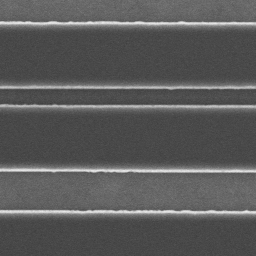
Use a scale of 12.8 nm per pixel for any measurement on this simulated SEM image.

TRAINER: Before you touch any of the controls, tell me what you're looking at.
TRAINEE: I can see lines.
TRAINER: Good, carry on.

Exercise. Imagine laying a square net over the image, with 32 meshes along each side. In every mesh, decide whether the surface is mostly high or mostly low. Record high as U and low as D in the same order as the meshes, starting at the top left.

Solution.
DDDDDDDDDDDDDDDDDDDDDDDDDDDDDDDD
DDDDDDDDDDDDDDDDDDDDDDDDDDDDDDDD
DDDDDDDDDDDDDDDDDDDDDDDDDDDDDDDD
UUUUUUUUUUUUUUUUUUUUUUUUUUUUUUUU
UUUUUUUUUUUUUUUUUUUUUUUUUUUUUUUU
UUUUUUUUUUUUUUUUUUUUUUUUUUUUUUUU
UUUUUUUUUUUUUUUUUUUUUUUUUUUUUUUU
UUUUUUUUUUUUUUUUUUUUUUUUUUUUUUUU
UUUUUUUUUUUUUUUUUUUUUUUUUUUUUUUU
UUUUUUUUUUUUUUUUUUUUUUUUUUUUUUUU
UUUUUUUUUUUUUUUUUUUUUUUUUUUUUUUU
DDDDDDDDDDDDDDDDDDDDDDDDDDDDDDDD
DDDDDDDDDDDDDDDDDDDDDDDDDDDDDDDD
UUUUUUUUUUUUUUUUUUUUUUUUUUUUUUUU
UUUUUUUUUUUUUUUUUUUUUUUUUUUUUUUU
UUUUUUUUUUUUUUUUUUUUUUUUUUUUUUUU
UUUUUUUUUUUUUUUUUUUUUUUUUUUUUUUU
UUUUUUUUUUUUUUUUUUUUUUUUUUUUUUUU
UUUUUUUUUUUUUUUUUUUUUUUUUUUUUUUU
UUUUUUUUUUUUUUUUUUUUUUUUUUUUUUUU
UUUUUUUUUUUUUUUUUUUUUUUUUUUUUUUU
DDDDDDDDDDDDDDDDDDDDDDDDDDDDDDDD
DDDDDDDDDDDDDDDDDDDDDDDDDDDDDDDD
DDDDDDDDDDDDDDDDDDDDDDDDDDDDDDDD
DDDDDDDDDDDDDDDDDDDDDDDDDDDDDDDD
DDDDDDDDDDDDDDDDDDDDDDDDDDDDDDDD
UUUUUUUUUUUUUUUUUUUUUUUUUUUUUUUU
UUUUUUUUUUUUUUUUUUUUUUUUUUUUUUUU
UUUUUUUUUUUUUUUUUUUUUUUUUUUUUUUU
UUUUUUUUUUUUUUUUUUUUUUUUUUUUUUUU
UUUUUUUUUUUUUUUUUUUUUUUUUUUUUUUU
UUUUUUUUUUUUUUUUUUUUUUUUUUUUUUUU